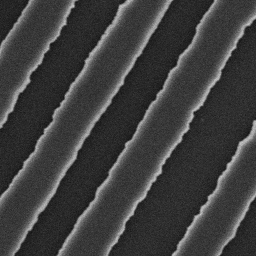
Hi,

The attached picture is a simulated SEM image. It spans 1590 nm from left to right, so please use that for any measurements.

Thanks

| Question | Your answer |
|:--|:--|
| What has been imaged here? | lines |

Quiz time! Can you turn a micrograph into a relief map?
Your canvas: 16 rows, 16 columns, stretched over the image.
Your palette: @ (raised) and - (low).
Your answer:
--@@----@@---@@@
-@@@---@@@--@@@@
@@@---@@@---@@@-
@@@---@@@--@@@--
@@---@@@---@@@--
@@--@@@---@@@---
@---@@@--@@@@---
---@@@---@@@----
---@@---@@@----@
--@@@---@@@----@
-@@@---@@@----@@
-@@@--@@@-----@@
@@@---@@@----@@@
@@---@@@----@@@-
@@--@@@@----@@@-
@---@@@----@@@--